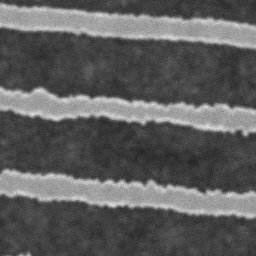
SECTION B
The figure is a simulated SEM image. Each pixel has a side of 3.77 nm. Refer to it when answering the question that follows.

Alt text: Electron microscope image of one or a few lines or trenches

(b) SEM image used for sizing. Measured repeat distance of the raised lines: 317 nm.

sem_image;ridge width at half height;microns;0.0809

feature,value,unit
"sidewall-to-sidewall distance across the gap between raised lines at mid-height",240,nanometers